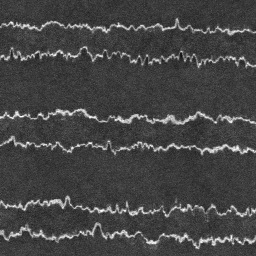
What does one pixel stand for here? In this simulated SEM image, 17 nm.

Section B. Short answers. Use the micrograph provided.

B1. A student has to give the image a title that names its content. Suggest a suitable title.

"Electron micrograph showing one or a few lines or trenches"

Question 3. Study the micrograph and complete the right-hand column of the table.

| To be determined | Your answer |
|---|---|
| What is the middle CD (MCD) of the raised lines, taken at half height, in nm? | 505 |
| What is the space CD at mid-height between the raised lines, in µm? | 1.01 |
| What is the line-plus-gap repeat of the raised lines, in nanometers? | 1530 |